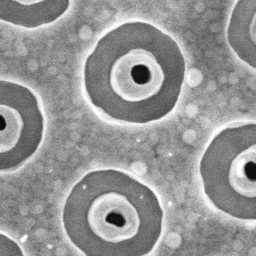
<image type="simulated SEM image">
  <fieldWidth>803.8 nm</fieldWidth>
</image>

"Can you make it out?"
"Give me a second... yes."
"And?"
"ring-shaped grooves with a dot in the middle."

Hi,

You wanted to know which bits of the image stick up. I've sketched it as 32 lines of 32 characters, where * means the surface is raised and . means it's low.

...*.....********************...
........*********************...
.......**********************...
**************......********....
*************........*******....
************..........*******...
************...........******...
***********....****....*******..
**********....***.**...*********
**********....**...*...*********
..********....***.**...*********
....*******....****....*********
.....******.....**....**********
*....*******..........**********
***..********........***********
.**..************************...
**...**********************.....
**...*********************......
*....*********************.....*
....*********************.....**
...**********************....**.
***********....**********....**.
**********.......********....***
*********..........******....***
*********....**....*******......
********....****....******......
********...******...********....
********...**...*...**********..
********....*****...************
.********....****...************
..*******..........*************
...*******.........*************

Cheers